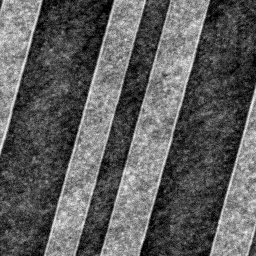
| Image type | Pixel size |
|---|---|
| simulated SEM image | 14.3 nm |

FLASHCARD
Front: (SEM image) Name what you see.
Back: lines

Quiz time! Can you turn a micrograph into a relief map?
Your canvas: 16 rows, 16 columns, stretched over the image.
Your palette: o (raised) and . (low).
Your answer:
oo.....oooooo...
oo.....oooooo...
oo.....ooooo....
oo....oooooo....
o.....oooooo....
o.....oooooo....
o....oooooo.....
o....oooooo.....
.....oooooo....o
.....ooooo.....o
....oooooo.....o
....oooooo....oo
....oooooo....oo
...oooooo.....oo
...oooooo.....oo
...oooooo....ooo